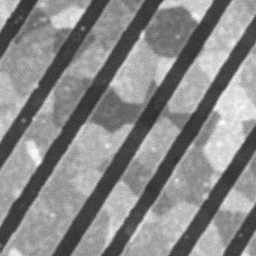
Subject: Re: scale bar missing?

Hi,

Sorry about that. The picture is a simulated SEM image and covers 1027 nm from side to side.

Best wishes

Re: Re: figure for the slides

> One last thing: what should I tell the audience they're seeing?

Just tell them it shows lines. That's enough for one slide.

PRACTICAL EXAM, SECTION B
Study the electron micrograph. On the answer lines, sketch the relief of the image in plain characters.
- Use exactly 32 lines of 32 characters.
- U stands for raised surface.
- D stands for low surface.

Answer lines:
UUDDDUUUUUUDDDUUUUDDUUUUUUDDDUUU
UUDDUUUUUUDDDUUUUDDDUUUUUUDDUUUU
UDDUUUUUUUDDUUUUDDDUUUUUUDDDUUUD
DDDUUUUUUDDDUUUUDDUUUUUUDDDUUUUD
DDUUUUUUUDDUUUUDDDUUUUUUDDUUUUDD
DUUUUUUUDDUUUUDDDUUUUUUDDDUUUDDD
DUUUUUUDDDUUUUDDUUUUUUUDDUUUUDDU
UUUUUUUDDUUUUDDDUUUUUUDDUUUUDDDU
UUUUUUDDUUUUUDDUUUUUUDDDUUUDDDUU
UUUUUDDDUUUUDDUUUUUUUDDUUUUDDUUU
UUUUUDDUUUUDDDUUUUUUDDDUUUDDDUUU
UUUUDDUUUUUDDUUUUUUDDDUUUUDDUUUU
UUUDDDUUUUDDDUUUUUUDDUUUUDDUUUUU
UUUDDUUUUDDDUUUUUUDDDUUUUDDUUUUU
UUDDUUUUUDDUUUUUUDDDUUUUDDUUUUUU
UDDDUUUUDDDUUUUUUDDUUUUDDDUUUUUU
UDDUUUUUDDUUUUUUDDDUUUDDDUUUUUUD
DDDUUUUDDUUUUUUUDDUUUUDDUUUUUUUD
DDUUUUDDDUUUUUUDDUUUUDDDUUUUUUDD
DUUUUDDDUUUUUUDDDUUUUDDUUUUUUDDD
DUUUUDDUUUUUUUDDUUUUDDUUUUUUUDDU
UUUUDDDUUUUUUDDDUUUDDDUUUUUUDDUU
UUUUDDUUUUUUDDDUUUUDDUUUUUUDDDUU
UUUDDUUUUUUUDDUUUUDDUUUUUUDDDUUU
UUDDDUUUUUUDDDUUUUDDUUUUUUDDUUUU
UDDDUUUUUUDDDUUUUDDUUUUUUDDDUUUU
UDDUUUUUUUDDUUUUDDDUUUUUUDDUUUUD
DDDUUUUUUDDDUUUUDDUUUUUUDDDUUUUD
DDUUUUUUUDDUUUUDDUUUUUUDDDUUUUDD
DDUUUUUUDDUUUUDDDUUUUUUDDUUUUDDD
DUUUUUUDDDUUUUDDUUUUUUDDDUUUUDDU
UUUUUUUDDUUUUDDUUUUUUDDDUUUUDDUU